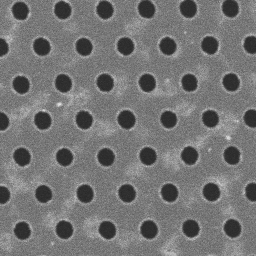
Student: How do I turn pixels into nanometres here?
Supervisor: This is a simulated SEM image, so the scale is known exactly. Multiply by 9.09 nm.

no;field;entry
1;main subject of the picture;a regular array of holes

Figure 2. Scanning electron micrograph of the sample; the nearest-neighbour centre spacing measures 379 nanometers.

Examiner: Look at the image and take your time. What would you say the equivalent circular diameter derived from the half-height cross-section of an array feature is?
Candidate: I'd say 18.2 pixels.